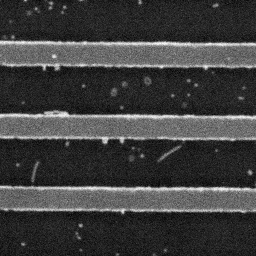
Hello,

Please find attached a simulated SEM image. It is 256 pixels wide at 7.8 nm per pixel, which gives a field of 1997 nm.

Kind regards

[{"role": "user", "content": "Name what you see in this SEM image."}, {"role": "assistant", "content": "lines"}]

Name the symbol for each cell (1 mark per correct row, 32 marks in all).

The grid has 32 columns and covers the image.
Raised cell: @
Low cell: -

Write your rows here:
--------------------------------
--------------------------------
--------------------------------
--------------------------------
--------------------------------
@@@@@@@@@@@@@@@@@@@@@@@@@@@@@@@@
@@@@@@@@@@@@@@@@@@@@@@@@@@@@@@@@
@@@@@@@@@@@@@@@@@@@@@@@@@@@@@@@@
--------------------------------
--------------------------------
--------------------------------
--------------------------------
--------------------------------
--------------------------------
@@@@@@@@@@@@@@@@@@@@@@-@--------
@@@@@@@@@@@@@@@@@@@@@@@@@@@@@@@@
@@@@@@@@@@@@@@@@@@@@@@@@@@@@@@@@
--------------------------------
--------------------------------
--------------------------------
--------------------------------
--------------------------------
--------------------------------
@@@@@@@@@@@@@@---@--------------
@@@@@@@@@@@@@@@@@@@@@@@@@@@@@@@@
@@@@@@@@@@@@@@@@@@@@@@@@@@@@@@@@
--------------------------------
--------------------------------
--------------------------------
--------------------------------
--------------------------------
--------------------------------